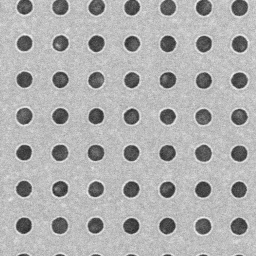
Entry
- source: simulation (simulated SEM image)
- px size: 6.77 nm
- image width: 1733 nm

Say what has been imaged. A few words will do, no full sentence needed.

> a regular array of holes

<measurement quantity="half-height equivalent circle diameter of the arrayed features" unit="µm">0.114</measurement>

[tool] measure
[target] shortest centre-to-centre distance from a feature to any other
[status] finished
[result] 242 nm